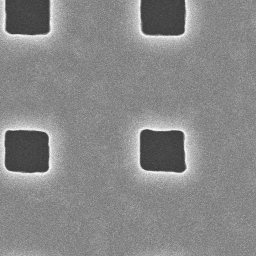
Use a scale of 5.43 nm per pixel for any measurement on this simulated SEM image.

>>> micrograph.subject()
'holes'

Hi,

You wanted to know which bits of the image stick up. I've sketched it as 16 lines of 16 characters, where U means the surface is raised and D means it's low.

DDDUUUUUUDDDUUUU
DDDUUUUUUDDDUUUU
UUUUUUUUUUUUUUUU
UUUUUUUUUUUUUUUU
UUUUUUUUUUUUUUUU
UUUUUUUUUUUUUUUU
UUUUUUUUUUUUUUUU
UUUUUUUUUUUUUUUU
DDDUUUUUUDDUUUUU
DDDUUUUUUDDDUUUU
UDDUUUUUUDDUUUUU
UUUUUUUUUUUUUUUU
UUUUUUUUUUUUUUUU
UUUUUUUUUUUUUUUU
UUUUUUUUUUUUUUUU
UUUUUUUUUUUUUUUU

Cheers